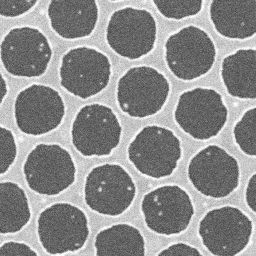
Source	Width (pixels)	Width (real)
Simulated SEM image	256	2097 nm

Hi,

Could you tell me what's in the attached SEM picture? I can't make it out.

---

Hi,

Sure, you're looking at a regular array of holes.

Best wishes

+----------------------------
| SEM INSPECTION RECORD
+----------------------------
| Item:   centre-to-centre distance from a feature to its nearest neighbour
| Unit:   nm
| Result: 491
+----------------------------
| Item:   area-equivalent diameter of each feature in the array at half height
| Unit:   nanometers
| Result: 430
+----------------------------